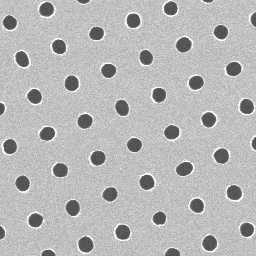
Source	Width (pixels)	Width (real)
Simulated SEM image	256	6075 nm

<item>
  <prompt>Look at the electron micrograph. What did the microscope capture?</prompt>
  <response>a regular array of holes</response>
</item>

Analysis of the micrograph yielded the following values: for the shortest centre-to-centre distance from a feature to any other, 924 nm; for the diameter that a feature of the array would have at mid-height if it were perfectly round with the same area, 340 nanometers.